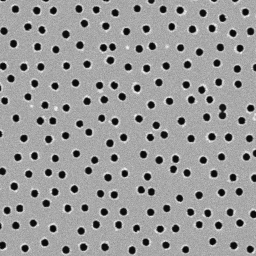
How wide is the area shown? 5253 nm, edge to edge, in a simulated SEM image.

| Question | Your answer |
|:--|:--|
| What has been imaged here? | a regular array of holes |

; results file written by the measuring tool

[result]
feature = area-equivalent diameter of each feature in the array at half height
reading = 157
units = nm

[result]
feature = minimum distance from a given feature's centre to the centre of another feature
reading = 341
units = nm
